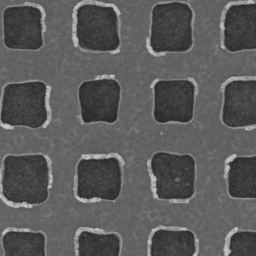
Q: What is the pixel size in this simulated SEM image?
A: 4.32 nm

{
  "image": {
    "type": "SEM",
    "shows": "a regular array of holes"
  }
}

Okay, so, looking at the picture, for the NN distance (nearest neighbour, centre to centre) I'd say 317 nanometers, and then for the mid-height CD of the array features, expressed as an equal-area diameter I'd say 205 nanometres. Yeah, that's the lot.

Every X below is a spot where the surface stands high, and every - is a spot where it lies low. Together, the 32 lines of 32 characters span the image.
XXXXXXXXXXX-XXXXXXXX---XXXXXXXXX
-----XXXXX----XXXXX-----XXXX----
-----XXXXX-----XXXX-----XXXX----
-----XXXX------XXXX-----XXXX----
-----XXXXX-----XXXX-----XXXX----
X----XXXXX-----XXXX-----XXXX----
XXXXXXXXXXXX-XXXXXXXXXXXXXXXXXXX
XXXXXXXXXXXXXXXXXXXXXXXXXXXXXXXX
XXXXXXXXXXXXXXXXXXXXXXXXXXXXXXXX
XXXXXXXXXXXXXXXXXXXXXXXXXXXXXXXX
XX---XXXXX-----XXXX-----XXXXX---
------XXXX-----XXXX-----XXXX----
------XXXX-----XXXX-----XXXX----
------XXXX-----XXXX-----XXXX----
------XXXX-----XXXX-----XXXX----
X----XXXXXXXXXXXXXXXXXXXXXXX----
XXXXXXXXXXXXXXXXXXXXXXXXXXXXXXXX
XXXXXXXXXXXXXXXXXXXXXXXXXXXXXXXX
XXXXXXXXXXXXXXXXXXXXXXXXXXXXXXXX
X----XXXXXXXXXXXXXX-----XXXXXXXX
------XXXX-----XXXX-----XXXXX---
------XXXX-----XXXX-----XXXXX---
------XXXX-----XXXXX----XXXX----
------XXXX-----XXXXX----XXXXX---
X-----XXXX-----XXXXX----XXXXX---
XXXX-XXXXXXXXXXXXXXXXXXXXXXXXXXX
XXXXXXXXXXXXXXXXXXXXXXXXXXXXXXXX
XXXXXXXXXXXXXXXXXXXXXXXXXXXXXXXX
XXXXXXXXXXXXXXXXXXXXXXXXXXXXXXXX
------XXXX-----XXXX-----XXXXX---
------XXXX-----XXXX-----XXXXX---
X-----XXXX-----XXXX-----XXXXX---